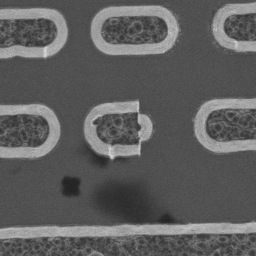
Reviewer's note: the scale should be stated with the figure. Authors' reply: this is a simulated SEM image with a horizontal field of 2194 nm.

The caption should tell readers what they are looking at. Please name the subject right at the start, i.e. one or a few lines or trenches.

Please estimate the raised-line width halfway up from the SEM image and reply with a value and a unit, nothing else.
0.343 um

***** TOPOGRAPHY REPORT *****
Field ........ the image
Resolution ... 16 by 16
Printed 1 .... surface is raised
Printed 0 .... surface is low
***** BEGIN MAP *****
0000000000000001
1111001111100011
1111001111100011
0000000000000000
0000000000000000
0000000000000000
0000000000000011
1110001110000111
1110001110000111
1100000000000000
0000000000000000
0000000000000000
0000000000000000
0000000000000000
0111111111111111
1111111111111111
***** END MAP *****